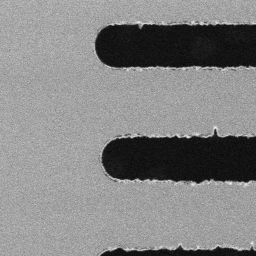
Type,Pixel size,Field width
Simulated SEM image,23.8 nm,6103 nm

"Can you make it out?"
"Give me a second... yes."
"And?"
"one or a few lines or trenches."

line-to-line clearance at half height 1590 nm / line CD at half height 1080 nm